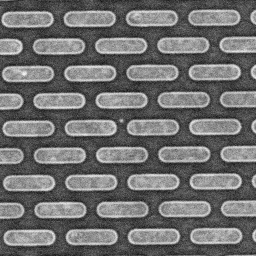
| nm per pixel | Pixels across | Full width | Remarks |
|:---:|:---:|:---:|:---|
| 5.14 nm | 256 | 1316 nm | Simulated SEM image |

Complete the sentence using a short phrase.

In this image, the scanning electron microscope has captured groups of lines, slits or small figures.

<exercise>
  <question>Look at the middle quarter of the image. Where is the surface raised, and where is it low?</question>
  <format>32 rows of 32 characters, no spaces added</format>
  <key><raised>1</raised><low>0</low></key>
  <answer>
00000000000000000111111111100000
01111111111110001111111111110000
11111111111110001111111111110000
01111111111100001111111111110000
00000000000000000000000000000000
00000000000000000000000000000000
00000000000000000000000000000000
11110000011111111111000011111111
11111000111111111111100011111111
11111000111111111111100011111111
11110000011111111111000001111111
00000000000000000000000000000000
00000000000000000000000000000000
00000000000000000000000000000000
01111111111100000111111111110000
01111111111110001111111111110000
01111111111110001111111111110000
01111111111100000111111100000000
00000000000000000000000000000000
00000000000000000000000000000000
00000000000000000000000000000000
11110000011111111111000011111111
11111000111111111111100011111111
11111000011111111111100011111111
11100000000000000000000000000000
00000000000000000000000000000000
00000000000000000000000000000000
00000000000000000000000000000000
01111111111110000111111111110000
01111111111110001111111111111000
01111111111110001111111111110000
00000000000000000000000000000000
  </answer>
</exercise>